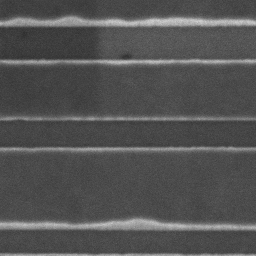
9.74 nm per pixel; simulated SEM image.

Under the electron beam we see lines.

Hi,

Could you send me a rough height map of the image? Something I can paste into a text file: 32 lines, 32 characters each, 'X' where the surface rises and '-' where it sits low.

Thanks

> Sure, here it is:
XXXXXXXXXXXXXXXXXXXXXXXXXXXXXXXX
XXXXXXXXXXXXXXXXXXXXXXXXXXXXXXXX
XXXXXXXXXXXXXXXXXXXXXXXXXXXXXXXX
--------------------------------
--------------------------------
--------------------------------
--------------------------------
--------------------------------
XXXXXXXXXXXXXXXXXXXXXXXXXXXXXXXX
XXXXXXXXXXXXXXXXXXXXXXXXXXXXXXXX
XXXXXXXXXXXXXXXXXXXXXXXXXXXXXXXX
XXXXXXXXXXXXXXXXXXXXXXXXXXXXXXXX
XXXXXXXXXXXXXXXXXXXXXXXXXXXXXXXX
XXXXXXXXXXXXXXXXXXXXXXXXXXXXXXXX
XXXXXXXXXXXXXXXXXXXXXXXXXXXXXXXX
--------------------------------
--------------------------------
--------------------------------
---------------------X--XXXXX---
XXXXXXXXXXXXXXXXXXXXXXXXXXXXXXXX
XXXXXXXXXXXXXXXXXXXXXXXXXXXXXXXX
XXXXXXXXXXXXXXXXXXXXXXXXXXXXXXXX
XXXXXXXXXXXXXXXXXXXXXXXXXXXXXXXX
XXXXXXXXXXXXXXXXXXXXXXXXXXXXXXXX
XXXXXXXXXXXXXXXXXXXXXXXXXXXXXXXX
XXXXXXXXXXXXXXXXXXXXXXXXXXXXXXXX
XXXXXXXXXXXXXXXXXXXXXXXXXXXXXXXX
XXXXXXXXXXXXXXXXXXXXXXXXXXXXXXXX
----------------------XXXXXXXXXX
--------------------------------
--------------------------------
--------------------------------